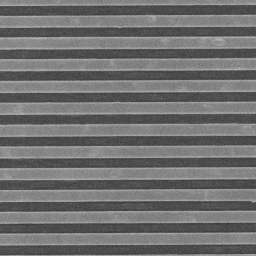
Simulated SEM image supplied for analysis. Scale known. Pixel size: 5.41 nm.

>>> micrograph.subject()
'parallel lines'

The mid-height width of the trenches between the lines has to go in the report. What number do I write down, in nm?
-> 52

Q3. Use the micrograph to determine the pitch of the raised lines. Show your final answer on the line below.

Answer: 118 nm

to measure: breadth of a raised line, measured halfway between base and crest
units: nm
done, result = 61.5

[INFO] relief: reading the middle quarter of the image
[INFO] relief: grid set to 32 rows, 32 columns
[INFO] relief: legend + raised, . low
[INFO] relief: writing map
++++++++++++++++++++++++++++++++
++++++++++++....................
................................
................................
++++++++++++++++++++++++++++++++
++++++++++++++++++++++++++++++++
++++++++++++++++++++++++++++++++
................................
................................
................................
++++++++++++++++++++++++++++++++
++++++++++++++++++++++++++++++++
................................
................................
................................
++++++++++++++++++++++++++++++++
++++++++++++++++++++++++++++++++
++++++++++++++++++++++++++++++++
................................
................................
................................
++++++++++++++++++++++++++++++++
++++++++++++++++++++++++++++++++
................................
................................
................................
++++++++++++++++++++++++++++++++
++++++++++++++++++++++++++++++++
++++++++++++++++++++++++++++++++
................................
................................
..++++......++++++++++++++++++++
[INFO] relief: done